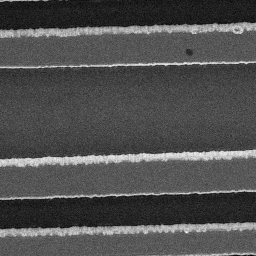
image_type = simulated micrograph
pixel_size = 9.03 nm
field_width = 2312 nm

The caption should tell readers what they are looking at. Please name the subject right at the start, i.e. lines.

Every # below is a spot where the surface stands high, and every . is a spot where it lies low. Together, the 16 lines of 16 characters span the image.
................
...............#
################
################
................
................
................
................
................
...............#
################
################
................
................
################
################